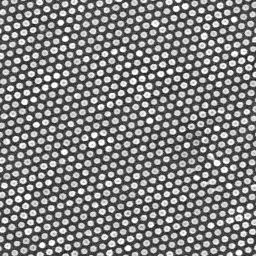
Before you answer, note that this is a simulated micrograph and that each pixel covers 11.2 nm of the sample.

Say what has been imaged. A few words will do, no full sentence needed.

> a regular array of raised bodies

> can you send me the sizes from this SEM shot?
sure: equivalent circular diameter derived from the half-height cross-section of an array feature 65.7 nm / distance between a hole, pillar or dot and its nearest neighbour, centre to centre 0.104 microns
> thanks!